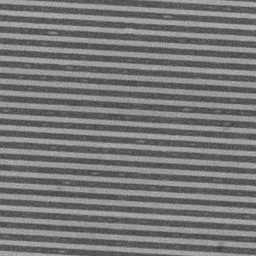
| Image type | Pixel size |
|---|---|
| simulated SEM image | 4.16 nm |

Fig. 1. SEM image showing parallel lines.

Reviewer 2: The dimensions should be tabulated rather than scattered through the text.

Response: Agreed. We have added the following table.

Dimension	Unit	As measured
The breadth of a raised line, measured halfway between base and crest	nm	21.3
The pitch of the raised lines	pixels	11.4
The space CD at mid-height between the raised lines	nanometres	28.5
